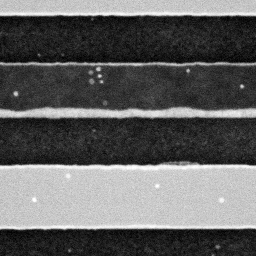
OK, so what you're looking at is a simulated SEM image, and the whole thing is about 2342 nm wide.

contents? lines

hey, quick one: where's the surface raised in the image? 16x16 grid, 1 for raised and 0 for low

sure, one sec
1111111111111111
0000000000000000
0000000000000000
0000000000000000
1111111111111111
1111111111111111
1111111111111111
0000000000000000
0000000000000000
0000000000000000
1111111111111111
1111111111111111
1111111111111111
1111111111111111
0000000000000000
0000000000000000